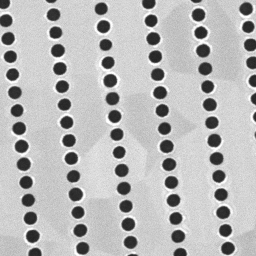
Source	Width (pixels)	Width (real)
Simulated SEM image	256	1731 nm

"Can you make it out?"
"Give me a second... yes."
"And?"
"a regular array of holes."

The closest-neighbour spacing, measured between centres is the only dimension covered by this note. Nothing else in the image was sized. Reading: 122 nm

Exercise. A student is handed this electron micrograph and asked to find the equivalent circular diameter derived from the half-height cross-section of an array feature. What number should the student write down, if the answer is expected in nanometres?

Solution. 91.6